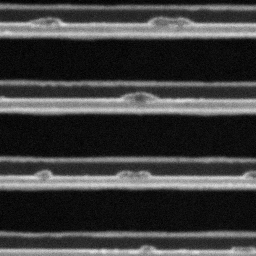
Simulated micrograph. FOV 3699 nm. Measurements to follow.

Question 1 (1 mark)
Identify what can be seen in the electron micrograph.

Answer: lines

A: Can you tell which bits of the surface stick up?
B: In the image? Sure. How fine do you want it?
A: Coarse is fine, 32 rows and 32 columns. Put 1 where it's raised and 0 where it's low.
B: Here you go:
00000000000000000000000000000000
11111111111111111111111111111111
11111111111111111111111111111111
11111111111111111111111111111111
00000000000000000000000000000000
00000000000000000000000000000000
00000000000000000000000000000000
00000000000000000000000000000000
00000000000000000000000000000000
00000000000000000000000000000000
11110000000000000000000000000000
11111111111111111111111111111111
11111111111111111111111111111111
11111111111111111111111111111111
00000000000000000000000000000000
00000000000000000000000000000000
00000000000000000000000000000000
00000000000000000000000000000000
00000000000000000000000000000000
00000000000000000000000000000000
11111111111111111111111111111111
11111111111111111111111111111111
11111111111111111111111111111111
00000000000000000000000000000000
00000000000000000000000000000000
00000000000000000000000000000000
00000000000000000000000000000000
00000000000000000000000000000000
00000000000000000000000000000000
11111111111111111111111111111111
11111111111111111111111111111111
11111111111111111111111111111111